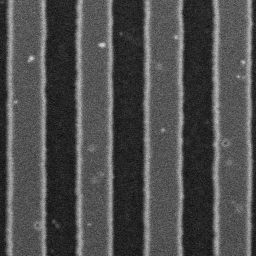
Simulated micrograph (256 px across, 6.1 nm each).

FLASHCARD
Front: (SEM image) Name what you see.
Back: lines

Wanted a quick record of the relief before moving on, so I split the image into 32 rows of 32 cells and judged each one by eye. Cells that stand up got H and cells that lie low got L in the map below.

LHHHHHLLLLHHHHLLLLHHHHHLLLLHHHHL
LHHHHHLLLLHHHHLLLLHHHHHLLLLHHHHL
LHHHHHLLLLHHHHLLLLHHHHHLLLLHHHHL
LHHHHHLLLLHHHHLLLLHHHHHLLLLHHHHL
LHHHHHLLLLHHHHLLLLHHHHHLLLLHHHHL
LHHHHHLLLLHHHHLLLLHHHHHLLLLHHHHL
LHHHHHLLLLHHHHLLLLHHHHHLLLLHHHHL
LHHHHHLLLLHHHHLLLLHHHHHLLLLHHHHL
LHHHHHLLLLHHHHLLLLHHHHHLLLLHHHHL
LHHHHHLLLLHHHHLLLLHHHHHLLLLHHHHL
LHHHHHLLLLHHHHLLLLHHHHHLLLLHHHHL
LHHHHHLLLLHHHHLLLLHHHHHLLLLHHHHL
LHHHHHLLLLHHHHLLLLHHHHHLLLLHHHHL
LHHHHHLLLLHHHHLLLLHHHHHLLLLHHHHL
LHHHHHLLLLHHHHLLLLHHHHHLLLLHHHHL
LHHHHHLLLLHHHHLLLLHHHHHLLLLHHHHL
LHHHHHLLLLHHHHLLLLHHHHHLLLLHHHHL
LHHHHHLLLLHHHHLLLLHHHHHLLLLHHHHL
LHHHHHLLLLHHHHLLLLHHHHHLLLLHHHHL
LHHHHHLLLLHHHHLLLLHHHHHLLLLHHHHL
LHHHHHLLLLHHHHLLLLHHHHHLLLLHHHHL
LHHHHHLLLLHHHHLLLLHHHHHLLLLHHHHL
LHHHHHLLLLHHHHLLLLHHHHHLLLLHHHHL
LHHHHHLLLLHHHHLLLLHHHHHLLLLHHHHL
LHHHHHLLLLHHHHLLLLHHHHHLLLLHHHHL
LHHHHHLLLLHHHHLLLLHHHHHLLLLHHHHL
LHHHHHLLLLHHHHLLLLHHHHHLLLLHHHHL
LHHHHHLLLLHHHHLLLLHHHHHLLLLHHHHL
LHHHHHLLLLHHHHLLLLHHHHHLLLLHHHHL
LHHHHHLLLLHHHHLLLLHHHHHLLLLHHHHL
LHHHHHLLLLHHHHLLLLHHHHHLLLLHHHHL
LHHHHHLLLLHHHHLLLLHHHHHLLLLHHHHL